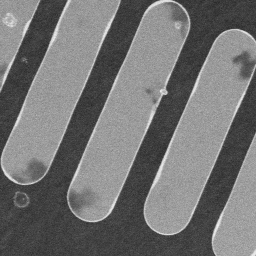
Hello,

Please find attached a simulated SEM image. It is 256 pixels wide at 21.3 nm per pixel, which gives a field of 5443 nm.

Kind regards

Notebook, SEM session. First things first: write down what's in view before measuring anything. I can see groups of lines, slits or small figures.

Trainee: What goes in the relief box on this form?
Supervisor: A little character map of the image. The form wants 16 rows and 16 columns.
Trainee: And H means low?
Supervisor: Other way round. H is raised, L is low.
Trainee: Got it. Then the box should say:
HHLLHHHLLHHLLLLL
HHLLHHHLLHHHLLLL
HLLHHHLLHHHHLLHH
HLLHHHLLHHHLLHHH
LLHHHHLHHHHLLHHH
LLHHHLLHHHLLHHHL
LHHHHLLHHHLLHHHL
LHHHLLHHHLLHHHHL
LHHHLLHHHLLHHHLL
HHHLLHHHHLHHHHLH
HHHLLHHHLLHHHLLH
LHLLHHHHLLHHHLLH
LLLLHHHLLHHHLLHH
LLLLLHHLLHHHLLHH
LLLLLLLLLLHLLHHH
LLLLLLLLLLLLLHHH